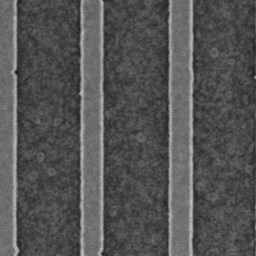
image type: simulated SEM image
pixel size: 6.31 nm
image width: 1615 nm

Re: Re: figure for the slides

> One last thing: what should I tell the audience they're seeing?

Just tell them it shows one or a few lines or trenches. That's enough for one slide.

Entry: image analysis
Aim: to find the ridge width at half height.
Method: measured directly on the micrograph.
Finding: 131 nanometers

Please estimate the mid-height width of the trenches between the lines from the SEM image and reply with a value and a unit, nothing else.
423 nm